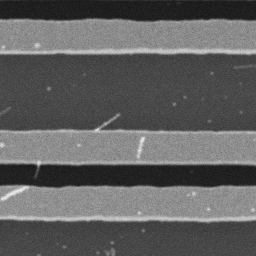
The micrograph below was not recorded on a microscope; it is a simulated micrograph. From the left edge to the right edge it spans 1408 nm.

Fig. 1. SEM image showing lines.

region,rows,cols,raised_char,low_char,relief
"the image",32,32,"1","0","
00000000000000000000000000000000
00000000000000000000000000000000
00110000001110100000000000100000
11111111111111111111111111111111
11111111111111111111111111111111
11111111111111111111111111111111
11111111111111111111111111111111
00000000000000000000000000000000
00000000000000000000000000000000
00000000000000000000000000000000
00000000000000000000000000000000
00000000000000000000000000000000
00000000000000000000000000000000
00000000000000000000000000000000
00000000000000000000000000000000
00000000000000000000000000000000
11111111111111111111111000101100
11111111111111111111111111111111
11111111111111111111111111111111
11111111111111111111111111111111
00001101111111111111111111111111
00000000000000000000000000000000
00000000000000000000000000000000
11111000111111111111111111111111
11111111111111111111111111111111
11111111111111111111111111111111
11111111111111111111111111111111
00000110110001110100111111110110
00000000000000000000000000000000
00000000000000000000000000000000
00000000000000000000000000000000
00000000000000000000000000000000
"